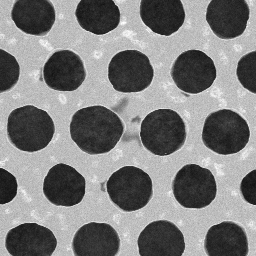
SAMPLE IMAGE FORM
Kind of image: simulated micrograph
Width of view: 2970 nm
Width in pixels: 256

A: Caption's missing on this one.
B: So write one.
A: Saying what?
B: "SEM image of a regular array of holes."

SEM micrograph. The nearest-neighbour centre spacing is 0.744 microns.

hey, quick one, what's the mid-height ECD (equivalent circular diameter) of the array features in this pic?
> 518 nm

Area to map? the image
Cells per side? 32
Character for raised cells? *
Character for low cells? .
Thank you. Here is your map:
**....****....****.....***.....*
**.....***.....***.....***.....*
**.....***.....***.....***.....*
**....****....*****...****.....*
***************************...**
********************************
.******..******...*****..*******
..****....****.....***....****..
..****....****.....***.....***..
..****.....***.....***.....***..
..****....****.....***.....***..
****************.******..******.
********************************
**...*****...*******************
*.....***......***....****....**
*......**......***.....**......*
*......**......***.....**......*
*.....***......***.....**......*
**...*****....****....****....**
********************************
*******.************************
.*****....****....****....*****.
..****.....**......***.....***..
..***......**......***.....***..
..****....****.....***.....***..
*******...*****...*****...******
********************************
********************************
**....****....****....****....**
*......**......**......***.....*
*......**......**......***.....*
*......**......**......***.....*